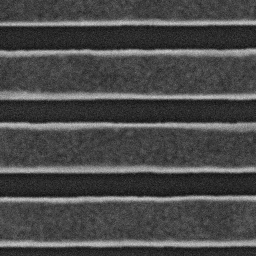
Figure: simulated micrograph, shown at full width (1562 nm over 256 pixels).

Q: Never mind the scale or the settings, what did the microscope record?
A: lines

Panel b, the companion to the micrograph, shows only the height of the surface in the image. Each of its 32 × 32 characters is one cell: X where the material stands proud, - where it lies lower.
XXXXXXXXXXXXXXXXXXXXXXXXXXXXXXXX
XXXXXXXXXXXXXXXXXXXXXXXXXXXXXXXX
XXXXXXXXXXXXXXXXXXXXXXXXXXXXXXXX
--------------------------------
--------------------------------
--------------------------------
----XXXXXXXX--XXXXXXXXXXX-X--XXX
XXXXXXXXXXXXXXXXXXXXXXXXXXXXXXXX
XXXXXXXXXXXXXXXXXXXXXXXXXXXXXXXX
XXXXXXXXXXXXXXXXXXXXXXXXXXXXXXXX
XXXXXXXXXXXXXXXXXXXXXXXXXXXXXXXX
XXXXXXXXXXXXXXXXXXXXXXXXXXXXXXXX
--------------------------------
--------------------------------
--------------------------------
--------------------------------
XXXXXXXXXXXXXXXXXXXXXXXXXXXXXXXX
XXXXXXXXXXXXXXXXXXXXXXXXXXXXXXXX
XXXXXXXXXXXXXXXXXXXXXXXXXXXXXXXX
XXXXXXXXXXXXXXXXXXXXXXXXXXXXXXXX
XXXXXXXXXXXXXXXXXXXXXXXXXXXXXXXX
--------------------------------
--------------------------------
--------------------------------
--------------------------------
XXXXXXXXXXXXXXXXXXXXXXXXXXXXXXXX
XXXXXXXXXXXXXXXXXXXXXXXXXXXXXXXX
XXXXXXXXXXXXXXXXXXXXXXXXXXXXXXXX
XXXXXXXXXXXXXXXXXXXXXXXXXXXXXXXX
XXXXXXXXXXXXXXXXXXXXXXXXXXXXXXXX
XXXXXXXXXX-XX---------XXXXXX----
--------------------------------